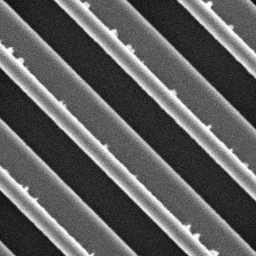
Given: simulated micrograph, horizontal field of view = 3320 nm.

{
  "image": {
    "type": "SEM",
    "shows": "lines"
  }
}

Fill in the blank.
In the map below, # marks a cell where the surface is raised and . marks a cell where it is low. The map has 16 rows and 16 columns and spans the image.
#...####....####
##...####....###
###...####....##
####...####....#
#####...####....
.#####...####...
..#####...####..
...#####...####.
#...#####...####
##...#####...###
###...#####...##
####...#####...#
.####...#####...
..####...#####..
...####...#####.
....####...#####